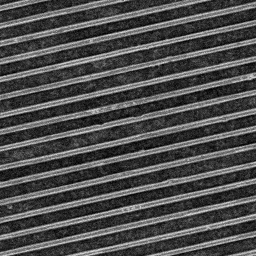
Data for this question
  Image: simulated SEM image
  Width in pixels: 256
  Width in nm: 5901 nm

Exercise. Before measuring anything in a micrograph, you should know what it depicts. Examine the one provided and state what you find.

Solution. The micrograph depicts parallel lines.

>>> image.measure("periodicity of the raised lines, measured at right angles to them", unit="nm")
397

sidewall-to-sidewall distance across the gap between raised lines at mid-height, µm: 0.29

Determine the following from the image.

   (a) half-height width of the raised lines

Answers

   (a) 104 nm